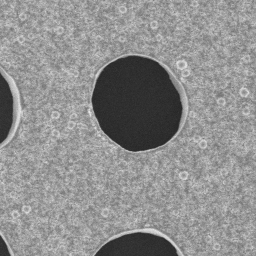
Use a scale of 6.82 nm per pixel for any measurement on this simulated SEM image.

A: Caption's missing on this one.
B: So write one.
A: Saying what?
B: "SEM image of holes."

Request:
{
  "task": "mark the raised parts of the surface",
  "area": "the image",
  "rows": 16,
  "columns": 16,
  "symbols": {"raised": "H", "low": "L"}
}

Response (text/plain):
HHHHHHHHHHHHHHHH
HHHHHHHHHHHHHHHH
HHHHHHHHHHHHHHHH
HHHHHHHHLHHHHHHH
HHHHHHLLLLLHHHHH
LHHHHHLLLLLHHHHH
LHHHHHLLLLLHHHHH
LHHHHHLLLLLHHHHH
LHHHHHHLLLLHHHHH
HHHHHHHHHHHHHHHH
HHHHHHHHHHHHHHHH
HHHHHHHHHHHHHHHH
HHHHHHHHHHHHHHHH
HHHHHHHHHHHHHHHH
HHHHHHHHHHHHHHHH
LHHHHHLLLLLHHHHH